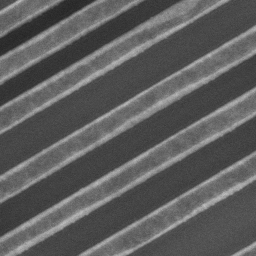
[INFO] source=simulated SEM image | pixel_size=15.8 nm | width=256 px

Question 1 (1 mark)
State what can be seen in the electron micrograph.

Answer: lines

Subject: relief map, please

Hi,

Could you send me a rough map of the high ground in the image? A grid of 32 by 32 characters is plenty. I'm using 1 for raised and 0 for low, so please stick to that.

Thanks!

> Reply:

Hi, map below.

00111110000111111000000111110000
11111000001111100000011111000000
11100000111110000001111100000000
11000011111100000111110000000000
00000111110000011111100000000011
00011111000001111110000000001111
01111110000011111000000000111111
11111000001111100000000001111100
11100000111111000000000111111000
10000001111100000000011111100000
00000111110000000000111110000000
00011111100000000011111000000001
00111110000000001111110000000111
11111000000000111111000000001111
11110000000001111100000000111111
11000000000111110000000011111100
00000000011111100000000111110000
00000000111110000000011111000000
00000011111000000001111110000000
00001111110000000111111000000001
00011111000000001111100000000111
01111100000000111110000000001111
11111000000011111100000000111110
11100000000111110000000011111100
11000000011111000000000111110000
00000001111100000000011111000000
00000111111000000001111110000000
00001111100000000111111000000000
00111111000000001111100000000000
11111100000000111111000000000000
11110000000011111100000000000000
11000000000111110000000000000011